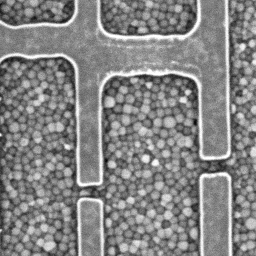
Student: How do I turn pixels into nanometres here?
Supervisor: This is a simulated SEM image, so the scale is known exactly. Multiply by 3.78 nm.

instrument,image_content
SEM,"one or a few lines or trenches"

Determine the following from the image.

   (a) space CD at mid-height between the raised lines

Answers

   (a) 376 nm